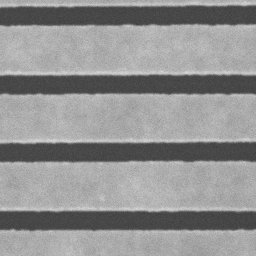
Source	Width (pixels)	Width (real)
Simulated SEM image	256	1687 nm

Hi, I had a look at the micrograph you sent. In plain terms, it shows lines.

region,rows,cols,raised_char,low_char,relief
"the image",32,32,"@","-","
@@@@@@@@@@@@@@@@@@@@@@@@@@@@@@@@
--------------------------------
--------------------------------
@@@@@@@@@@@@@@@@@@@@@@@@@@@@@@@@
@@@@@@@@@@@@@@@@@@@@@@@@@@@@@@@@
@@@@@@@@@@@@@@@@@@@@@@@@@@@@@@@@
@@@@@@@@@@@@@@@@@@@@@@@@@@@@@@@@
@@@@@@@@@@@@@@@@@@@@@@@@@@@@@@@@
@@@@@@@@@@@@@@@@@@@@@@@@@@@@@@@@
--------------------------------
--------------------------------
--------------------------------
@@@@@@@@@@@@@@@@@@@@@@@@@@@@@@@@
@@@@@@@@@@@@@@@@@@@@@@@@@@@@@@@@
@@@@@@@@@@@@@@@@@@@@@@@@@@@@@@@@
@@@@@@@@@@@@@@@@@@@@@@@@@@@@@@@@
@@@@@@@@@@@@@@@@@@@@@@@@@@@@@@@@
@@@@@@@@@@@@@@@@@@@@@@@@@@@@@@@@
--------------------------------
--------------------------------
@@@@@@@@@@@@@@@@@@@@@@@@@@@@@@@@
@@@@@@@@@@@@@@@@@@@@@@@@@@@@@@@@
@@@@@@@@@@@@@@@@@@@@@@@@@@@@@@@@
@@@@@@@@@@@@@@@@@@@@@@@@@@@@@@@@
@@@@@@@@@@@@@@@@@@@@@@@@@@@@@@@@
@@@@@@@@@@@@@@@@@@@@@@@@@@@@@@@@
--------------------------------
--------------------------------
--------------------------------
@@@@@@@@@@@@@@@@@@@@@@@@@@@@@@@@
@@@@@@@@@@@@@@@@@@@@@@@@@@@@@@@@
@@@@@@@@@@@@@@@@@@@@@@@@@@@@@@@@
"